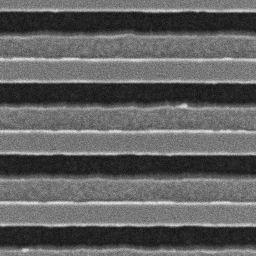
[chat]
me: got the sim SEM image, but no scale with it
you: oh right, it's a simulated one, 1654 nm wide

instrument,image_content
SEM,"lines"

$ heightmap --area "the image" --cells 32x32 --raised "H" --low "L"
HHHHHHHHHHHHHHHHHHHHHHHHHHHHHHHH
LLLLLLLLLLLLLLLLLLLLLLLLLLLLLLLL
LLLLLLLLLLLLLLLLLLLLLLLLLLLLLLLL
LLLLLLLLLLLLLLLLLLLLLLLLLLLLLLLL
LLLLHHLLLLLLHHHHHLLLLHLHLHLHHHLL
HHHHHHHHHHHHHHHHHHHHHHHHHHHHHHHH
HHHHHHHHHHHHHHHHHHHHHHHHHHHHHHHH
HHHHHHHHHHHHHHHHHHHHHHHHHHHHHHHH
HHHHHHHHHHHHHHHHHHHHHHHHHHHHHHHH
HHHHHHHHHHHHHHHHHHHHHHHHHHHHHHHH
LLLLLLLLLLLLLLLLLLLLLLLLLLLLLLLL
LLLLLLLLLLLLLLLLLLLLLLLLLLLLLLLL
LLLLLLLLLLLLLLLLLLLLLLLLLLLLLLLL
HHHHHHHHHHHHHLHHHHHHHHHHHHHHHHHH
HHHHHHHHHHHHHHHHHHHHHHHHHHHHHHHH
HHHHHHHHHHHHHHHHHHHHHHHHHHHHHHHH
HHHHHHHHHHHHHHHHHHHHHHHHHHHHHHHH
HHHHHHHHHHHHHHHHHHHHHHHHHHHHHHHH
HHHHHHHHHHHHHHHHHHHHHHHHHHHHHHHH
LLLLLLLLLLLLLLLLLLLLLLLLLLLLLLLL
LLLLLLLLLLLLLLLLLLLLLLLLLLLLLLLL
LLLLLLLLLLLLLLLLLLLLLLLLLLLLLLLL
HHHHHHHHHLLHHHLLLHHLLLHHHHHHHHHH
HHHHHHHHHHHHHHHHHHHHHHHHHHHHHHHH
HHHHHHHHHHHHHHHHHHHHHHHHHHHHHHHH
HHHHHHHHHHHHHHHHHHHHHHHHHHHHHHHH
HHHHHHHHHHHHHHHHHHHHHHHHHHHHHHHH
HHHHHHHHHHHHHHHHHHHHHHHHHHHHHHHH
LLLLLLLLLLLLLLLLLLLLLLLLLLLLLLLL
LLLLLLLLLLLLLLLLLLLLLLLLLLLLLLLL
LLLLLLLLLLLLLLLLLLLLLLLLLLLLLLLL
HHHHHHHHHHHHHHHHHHHHHHHHHHHHHHHH